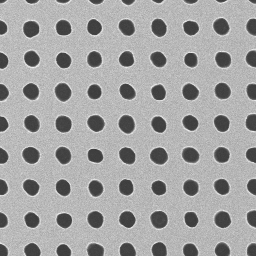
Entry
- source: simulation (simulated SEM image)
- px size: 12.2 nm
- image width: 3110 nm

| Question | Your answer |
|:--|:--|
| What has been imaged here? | a regular array of holes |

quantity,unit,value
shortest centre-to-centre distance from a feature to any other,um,0.381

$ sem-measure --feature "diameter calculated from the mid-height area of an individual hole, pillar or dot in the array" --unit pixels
15